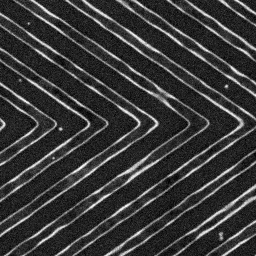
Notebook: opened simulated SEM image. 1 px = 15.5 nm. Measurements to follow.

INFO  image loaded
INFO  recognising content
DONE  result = groups of lines, slits or small figures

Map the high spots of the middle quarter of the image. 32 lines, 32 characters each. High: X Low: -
XXX--------XXXXX--------XXXXX---
XXXXX--------XXXX---------XXXX--
--XXXX--------XXXXX--------XXXXX
---XXXXX--------XXXXX-------XXXX
-----XXXX--------XXXXX--------XX
------XXXXX--------XXXX--------X
--------XXXX--------XXXX--------
X--------XXXX---------XXXX------
XX--------XXXXX---------XXX-----
XXX---------XXXX---------XXXX---
-XXXX---------XXXX--------XXXXX-
--XXXX---------XXXX---------XXXX
----XXXX--------XXXXX--------XXX
-----XXXXX--------XXXX--------XX
------XXXXX--------XXXX--------X
------XXXXX-------XXXXX--------X
-----XXXX--------XXXXX--------XX
---XXXXX--------XXXXX--------XXX
--XXXXX--------XXXX--------XXXXX
-XXXX--------XXXX---------XXXX--
XXXX--------XXXX--------XXXXX---
XX--------XXXXX--------XXXXX----
X--------XXXX--------XXXXX------
-------XXXX---------XXXX--------
------XXXX---------XXXX--------X
-----XXXX---------XXX---------XX
---XXXXX--------XXXX--------XXXX
--XXXX---------XXX---------XXXX-
XXXXX--------XXXX--------XXXXX--
XXX---------XXXX--------XXXX----
XX--------XXXXX--------XXXX-----
X--------XXXX--------XXXXX------